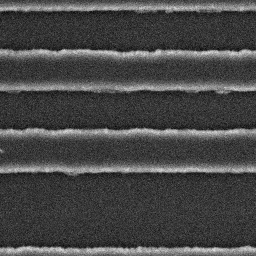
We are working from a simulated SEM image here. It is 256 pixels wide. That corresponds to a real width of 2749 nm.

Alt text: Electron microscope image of lines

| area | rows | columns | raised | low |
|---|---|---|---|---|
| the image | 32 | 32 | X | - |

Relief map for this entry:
XXXXXXXXXXXXXXXXXXXXXXXXXXXXXXXX
--------------------------------
--------------------------------
--------------------------------
--------------------------------
--------------------------------
XX-XXXXXXXXXXX---X-XXXXX--XXX-XX
XXXXXXXXXXXXXXXXXXXXXXXXXXXXXXXX
XXXXXXXXXXXXXXXXXXXXXXXXXXXXXXXX
XXXXXXXXXXXXXXXXXXXXXXXXXXXXXXXX
XXXXXXXXXXXXXXXXXXXXXXXXXXXXXXXX
--------------------------------
--------------------------------
--------------------------------
--------------------------------
--------------------------------
XXXXXX-XXXXXXXXXXXXXXXXXX--XXXXX
XXXXXXXXXXXXXXXXXXXXXXXXXXXXXXXX
XXXXXXXXXXXXXXXXXXXXXXXXXXXXXXXX
XXXXXXXXXXXXXXXXXXXXXXXXXXXXXXXX
XXXXXXXXXXXXXXXXXXXXXXXXXXXXXXXX
--------------------------------
--------------------------------
--------------------------------
--------------------------------
--------------------------------
--------------------------------
--------------------------------
--------------------------------
--------------------------------
--------------------------------
XXXXXXXXXXXXXXXXXXXXXXXXXXXXXXXX